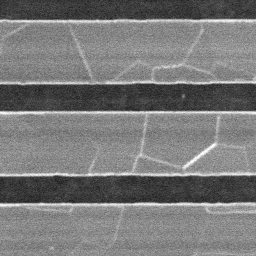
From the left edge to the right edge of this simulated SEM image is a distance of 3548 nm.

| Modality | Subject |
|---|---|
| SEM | lines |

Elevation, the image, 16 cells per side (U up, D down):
DDDDDDDDDDDDDDDD
UUUUUUUUUUUUUUUU
UUUUUUUUUUUUUUUU
UUUUUUUUUUUUUUUU
UUUUUUUUUUUUUUUU
DDDDDDDDDDDDDDDD
DDDDDDDDDDDDDDDD
UUUUUUUUUUUUUUUU
UUUUUUUUUUUUUUUU
UUUUUUUUUUUUUUUU
UUUUUUUUUUUUUUUU
DDDDDDDDDDDDDDDD
DDDDDDDDDDDDDDDD
UUUUUUUUUUUUUUUU
UUUUUUUUUUUUUUUU
UUUUUUUUUUUUUUUU